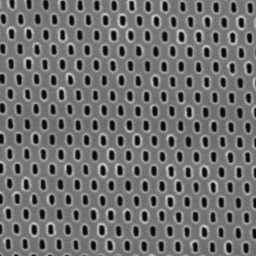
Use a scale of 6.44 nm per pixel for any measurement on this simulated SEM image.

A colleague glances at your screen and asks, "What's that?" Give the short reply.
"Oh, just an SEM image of a regular array of holes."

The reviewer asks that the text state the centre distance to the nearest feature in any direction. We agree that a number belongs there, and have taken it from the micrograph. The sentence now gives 0.107 um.